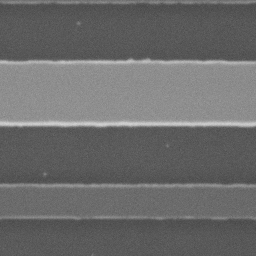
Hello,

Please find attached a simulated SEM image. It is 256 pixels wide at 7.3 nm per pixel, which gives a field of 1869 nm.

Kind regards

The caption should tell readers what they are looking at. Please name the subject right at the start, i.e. lines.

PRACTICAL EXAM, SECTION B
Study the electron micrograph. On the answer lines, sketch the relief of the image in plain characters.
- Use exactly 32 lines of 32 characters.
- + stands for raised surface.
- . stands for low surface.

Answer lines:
................................
................................
................................
................................
................................
................................
................................
................................
++++++++++++++++++++++++++++++++
++++++++++++++++++++++++++++++++
++++++++++++++++++++++++++++++++
++++++++++++++++++++++++++++++++
++++++++++++++++++++++++++++++++
++++++++++++++++++++++++++++++++
++++++++++++++++++++++++++++++++
++++++++++++++++++++++++++++++++
................................
................................
................................
................................
................................
................................
................................
++++++++++++++++++++++++++++++++
++++++++++++++++++++++++++++++++
++++++++++++++++++++++++++++++++
++++++++++++++++++++++++++++++++
................................
................................
................................
................................
................................